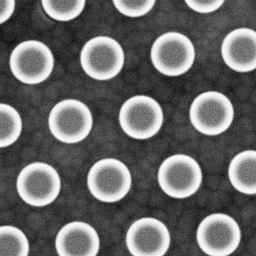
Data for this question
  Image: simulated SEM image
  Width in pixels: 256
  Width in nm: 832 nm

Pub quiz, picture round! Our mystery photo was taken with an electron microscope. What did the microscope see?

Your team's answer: an array of small figures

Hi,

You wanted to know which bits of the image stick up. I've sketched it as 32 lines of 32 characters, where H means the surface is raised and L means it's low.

HHLLLHHHHHLLLLHHHHHLLLLLHHHHLLLL
HHLLLLHHHHLLLLLHHHLLLLLLLHLLLLLL
HLLLLLLHLLLLLLLLLLLLLLLLLLLLLLLL
LLLLLLLLLLLLLLLLLLLLLLLLLLLLLLLL
LLLLLLLLLLLLLLLLLLLLHHHLLLLLHHHH
LLLHHLLLLLLHHHHLLLLHHHHHLLLLHHHH
LLHHHHLLLLHHHHHLLLLHHHHHLLLLHHHH
LHHHHHHLLLHHHHHLLLLHHHHHLLLLHHHH
LHHHHHLLLLHHHHHLLLLLHHHHLLLLLHHH
LLHHHHLLLLLHHHLLLLLLLLLLLLLLLLLL
LLLLLLLLLLLLLLLLLLLLLLLLLLLLLLLL
LLLLLLLLLLLLLLLLLLLLLLLLLLLLLLLL
LLLLLLLLLLLLLLLLHHHLLLLLHHHHLLLL
HLLLLLLHHHHLLLLHHHHHLLLLHHHHHLLL
HHLLLLHHHHHLLLLHHHHHLLLLHHHHHLLL
HHHLLLHHHHHLLLLHHHHHLLLLHHHHHLLL
HHLLLLLHHHHLLLLLHHHLLLLLLHHHLLLL
HHLLLLLLHHLLLLLLLLLLLLLLLLLLLLLL
LLLLLLLLLLLLLLLLLLLLLLLLLLLLLLLL
LLLLLLLLLLLLLLLLLLLLLLHLLLLLLLHH
LLLLHLLLLLLLHHHLLLLLHHHHHLLLLHHH
LLLHHHHLLLLHHHHHLLLLHHHHHLLLLHHH
LLHHHHHLLLLHHHHHLLLLHHHHHLLLLHHH
LLHHHHHLLLLHHHHHLLLLHHHHHLLLLLHH
LLLHHHHLLLLLHHHLLLLLLLHLLLLLLLLL
LLLLHHLLLLLLLLLLLLLLLLLLLLLLLLLL
LLLLLLLLLLLLLLLLLLLLLLLLLLLLLLLL
LLLLLLLLLLLLLLLLLLHLLLLLLLHHHLLL
HHLLLLLLHHHLLLLLHHHHHLLLLHHHHHLL
HHHLLLLHHHHHLLLLHHHHHLLLLHHHHHLL
HHHLLLLHHHHHLLLLHHHHHLLLLHHHHHLL
HHHLLLLHHHHHLLLLHHHHHLLLLLHHHLLL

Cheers